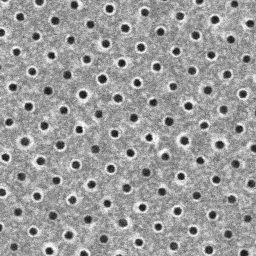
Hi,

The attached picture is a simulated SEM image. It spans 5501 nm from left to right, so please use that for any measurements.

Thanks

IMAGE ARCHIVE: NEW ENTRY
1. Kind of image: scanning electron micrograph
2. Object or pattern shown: a regular array of holes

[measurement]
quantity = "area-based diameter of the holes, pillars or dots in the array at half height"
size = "198 nm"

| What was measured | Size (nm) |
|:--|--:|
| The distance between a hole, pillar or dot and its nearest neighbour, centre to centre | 533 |